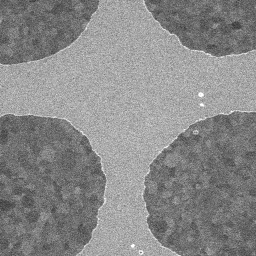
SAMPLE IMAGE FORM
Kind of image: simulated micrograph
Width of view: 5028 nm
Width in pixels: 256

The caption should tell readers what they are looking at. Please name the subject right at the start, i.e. raised bodies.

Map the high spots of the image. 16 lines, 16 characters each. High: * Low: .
******...*******
******....******
*****......*****
***..........*..
................
................
................
****.........***
*****......*****
******....******
******...*******
*******..*******
*******..*******
******...*******
******...*******
*****.....******